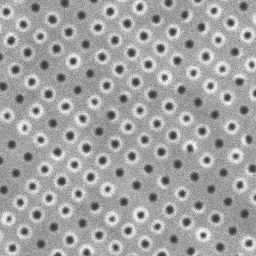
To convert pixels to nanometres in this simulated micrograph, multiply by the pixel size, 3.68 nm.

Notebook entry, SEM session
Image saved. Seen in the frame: a regular array of holes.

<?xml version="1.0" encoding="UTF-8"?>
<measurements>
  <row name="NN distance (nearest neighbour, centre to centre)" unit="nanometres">75.1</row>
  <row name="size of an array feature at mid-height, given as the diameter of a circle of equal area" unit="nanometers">31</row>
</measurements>